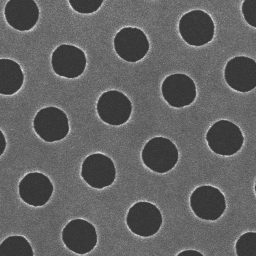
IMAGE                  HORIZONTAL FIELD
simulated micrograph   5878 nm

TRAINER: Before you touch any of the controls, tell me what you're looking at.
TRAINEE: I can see a regular array of holes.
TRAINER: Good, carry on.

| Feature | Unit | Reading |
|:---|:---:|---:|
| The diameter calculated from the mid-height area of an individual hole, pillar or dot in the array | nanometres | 805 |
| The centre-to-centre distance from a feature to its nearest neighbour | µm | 1.49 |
